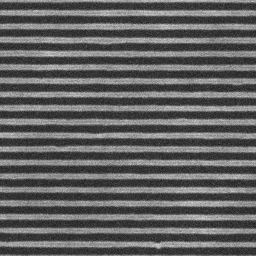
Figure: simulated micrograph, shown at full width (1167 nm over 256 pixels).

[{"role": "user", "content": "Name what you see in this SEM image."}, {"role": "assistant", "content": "parallel lines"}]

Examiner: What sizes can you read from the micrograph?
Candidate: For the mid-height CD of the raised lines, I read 0.0194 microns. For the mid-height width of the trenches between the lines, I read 9.25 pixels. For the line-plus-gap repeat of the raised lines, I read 13.6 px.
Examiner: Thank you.